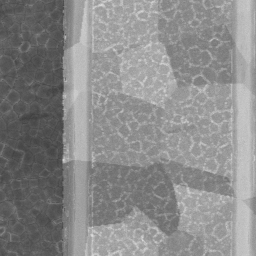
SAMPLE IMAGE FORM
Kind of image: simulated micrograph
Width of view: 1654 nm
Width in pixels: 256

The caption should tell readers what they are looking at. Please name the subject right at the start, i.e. one or a few lines or trenches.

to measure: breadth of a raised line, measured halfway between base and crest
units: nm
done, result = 1070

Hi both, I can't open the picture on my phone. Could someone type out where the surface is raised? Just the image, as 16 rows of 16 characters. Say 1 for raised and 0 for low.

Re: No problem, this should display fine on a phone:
0000011111111110
0000011111111110
0000011111111110
0000011111111110
0000011111111110
0000011111111110
0000011111111110
0000011111111110
0000011111111110
0000011111111110
0000011111111110
0000011111111110
0000011111111110
0000011111111110
0000011111111110
0000011111111110